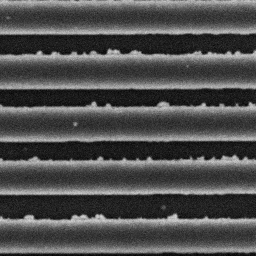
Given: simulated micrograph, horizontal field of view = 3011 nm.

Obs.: lines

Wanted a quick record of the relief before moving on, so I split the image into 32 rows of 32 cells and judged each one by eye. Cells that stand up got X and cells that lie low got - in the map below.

XXXXXXXXXXXXXXXXXXXXXXXXXXXXXXXX
XXXXXXXXXXXXXXXXXXXXXXXXXXXXXXXX
XXXXXXXXXXXXXXXXXXXXXXXXXXXXXXXX
XXXXXXXXXXXXXXXXXXXXXXXXXXXXXXXX
--------------------------------
--------------------------------
--------------------------------
XXXXXXXXXXXXXXXXXXXXXXXXXXXXXXXX
XXXXXXXXXXXXXXXXXXXXXXXXXXXXXXXX
XXXXXXXXXXXXXXXXXXXXXXXXXXXXXXXX
XXXXXXXXXXXXXXXXXXXXXXXXXXXXXXXX
--------------------------------
--------------------------------
---------------------XXXXXX-XX-X
XXXXXXXXXXXXXXXXXXXXXXXXXXXXXXXX
XXXXXXXXXXXXXXXXXXXXXXXXXXXXXXXX
XXXXXXXXXXXXXXXXXXXXXXXXXXXXXXXX
XXXXXXXXX-XX------XXXX----------
--------------------------------
--------------------------------
XXXXXXXXXXXXXXXXXXXXXXXXXXXXXXXX
XXXXXXXXXXXXXXXXXXXXXXXXXXXXXXXX
XXXXXXXXXXXXXXXXXXXXXXXXXXXXXXXX
XXXXXXXXXXXXXXXXXXXXXXXXXXXXXXXX
--------------------------------
--------------------------------
--------------------------------
-------------------------XXXX-XX
XXXXXXXXXXXXXXXXXXXXXXXXXXXXXXXX
XXXXXXXXXXXXXXXXXXXXXXXXXXXXXXXX
XXXXXXXXXXXXXXXXXXXXXXXXXXXXXXXX
--------------------------------